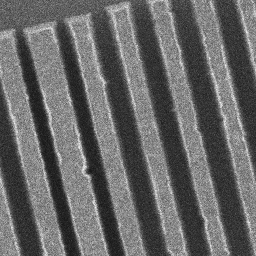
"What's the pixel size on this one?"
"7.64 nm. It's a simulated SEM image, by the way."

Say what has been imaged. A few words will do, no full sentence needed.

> parallel lines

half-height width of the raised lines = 169 nm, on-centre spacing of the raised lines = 310 nanometers